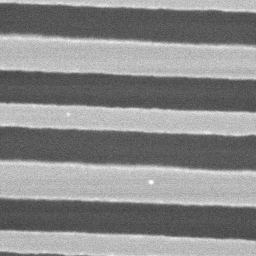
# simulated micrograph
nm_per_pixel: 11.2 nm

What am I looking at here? lines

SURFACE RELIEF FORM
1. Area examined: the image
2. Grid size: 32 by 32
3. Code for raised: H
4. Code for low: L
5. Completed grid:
LLLLLLLLHHHHHHHHHHHHHHHHHHHHHHHH
LLLLLLLLLLLLLLLLLLLLLLLLLLLLLLLL
LLLLLLLLLLLLLLLLLLLLLLLLLLLLLLLL
LLLLLLLLLLLLLLLLLLLLLLLLLLLLLLLL
LLLLLLLLLLLLLLLLLLLLLLLLLLLLLLLL
HHHHHHHHHHHHHHHHHHHLLLLLLLLLLLLL
HHHHHHHHHHHHHHHHHHHHHHHHHHHHHHHH
HHHHHHHHHHHHHHHHHHHHHHHHHHHHHHHH
HHHHHHHHHHHHHHHHHHHHHHHHHHHHHHHH
LLLLLLLLLLLLLLLLLLLLLLLHHHHHHHHH
LLLLLLLLLLLLLLLLLLLLLLLLLLLLLLLL
LLLLLLLLLLLLLLLLLLLLLLLLLLLLLLLL
LLLLLLLLLLLLLLLLLLLLLLLLLLLLLLLL
HHHHHHHHHHHHHLLLLLLLLLLLLLLLLLLL
HHHHHHHHHHHHHHHHHHHHHHHHHHHHHHHH
HHHHHHHHHHHHHHHHHHHHHHHHHHHHHHHH
LLLLLLLLLLLLLLLLLLLLLHHHHHHHHHHH
LLLLLLLLLLLLLLLLLLLLLLLLLLLLLLLL
LLLLLLLLLLLLLLLLLLLLLLLLLLLLLLLL
LLLLLLLLLLLLLLLLLLLLLLLLLLLLLLLL
HHHHLLLLLLLLLLLLLLLLLLLLLLLLLLLL
HHHHHHHHHHHHHHHHHHHHHHHHHHLLLLLL
HHHHHHHHHHHHHHHHHHHHHHHHHHHHHHHH
HHHHHHHHHHHHHHHHHHHHHHHHHHHHHHHH
HHHHHHHHHHHHHHHHHHHHHHHHHHHHHHHH
LLLLLLLLLLLLLLLLLLLLLLLLHHHHHHHH
LLLLLLLLLLLLLLLLLLLLLLLLLLLLLLLL
LLLLLLLLLLLLLLLLLLLLLLLLLLLLLLLL
LLLLLLLLLLLLLLLLLLLLLLLLLLLLLLLL
HHHHHHHHHHHHHHHHHHLLLLLLLLLLLLLL
HHHHHHHHHHHHHHHHHHHHHHHHHHHHHHHH
LLHHHHHHHHHHHHHHHHHHHHHHHHHHHHHH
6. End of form